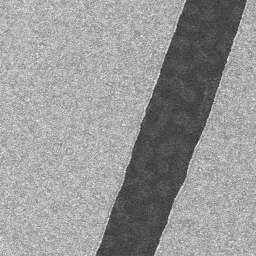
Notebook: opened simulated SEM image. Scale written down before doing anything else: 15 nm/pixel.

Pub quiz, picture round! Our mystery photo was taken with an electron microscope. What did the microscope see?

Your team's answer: one or a few lines or trenches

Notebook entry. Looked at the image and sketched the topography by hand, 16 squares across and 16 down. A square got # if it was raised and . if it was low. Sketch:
###########....#
###########....#
###########....#
##########....##
##########....##
##########....##
#########....###
#########....###
#########....###
########....####
########....####
########...#####
#######....#####
#######....#####
#######...######
######....######